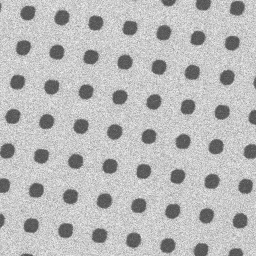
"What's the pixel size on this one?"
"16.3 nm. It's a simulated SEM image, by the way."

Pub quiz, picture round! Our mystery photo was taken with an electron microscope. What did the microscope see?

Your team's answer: a regular array of holes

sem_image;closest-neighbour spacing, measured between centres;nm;558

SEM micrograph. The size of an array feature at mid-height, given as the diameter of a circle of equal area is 252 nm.